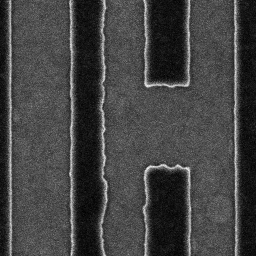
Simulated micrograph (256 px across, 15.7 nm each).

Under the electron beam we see one or a few lines or trenches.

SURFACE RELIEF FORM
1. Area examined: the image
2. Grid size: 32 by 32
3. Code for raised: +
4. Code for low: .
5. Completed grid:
+........++++.....++++++.....+++
+........++++.....++++++.....+++
+........++++.....++++++.....+++
+........++++.....++++++.....+++
+........++++.....++++++.....+++
+........++++.....++++++.....+++
+........++++.....++++++.....+++
+........++++.....++++++.....+++
+........++++.....++++++.....+++
+........++++.....++++++.....+++
+........++++.....+++++......+++
+........++++................+++
+........++++................+++
+........++++................+++
+........++++................+++
+........++++................+++
+........++++................+++
+........++++................+++
+........++++.................++
+........++++................+++
+........++++................+++
+........++++.....++++++......++
+........++++.....++++++......++
+........++++.....++++++.....+++
+........++++.....++++++.....+++
+........++++.....++++++...+..++
+........++++.....++++++...+..++
+........++++.....++++++......++
+........++++.....++++++......++
+........++++.....++++++......++
+........++++.....++++++......++
+........++++.....++++++.....+++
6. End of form